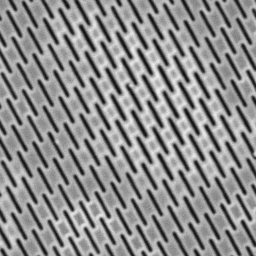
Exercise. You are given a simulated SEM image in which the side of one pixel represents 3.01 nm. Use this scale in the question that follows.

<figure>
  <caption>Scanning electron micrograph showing a regular array of holes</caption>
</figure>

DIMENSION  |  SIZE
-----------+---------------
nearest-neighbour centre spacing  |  55 nanometres